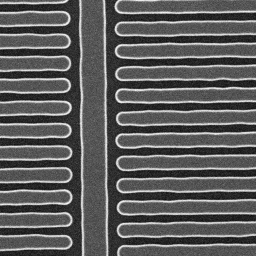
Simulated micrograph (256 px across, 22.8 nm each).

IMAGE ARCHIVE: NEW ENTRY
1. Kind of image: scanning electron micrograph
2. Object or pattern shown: groups of lines, slits or small figures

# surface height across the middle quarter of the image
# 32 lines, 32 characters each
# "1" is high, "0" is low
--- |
10001111110000000000000000000000
00001111110001111111111111111111
00001111110001111111111111111111
00001111110001111111111111111111
10001111110000000000000000000000
10001111110000000000000000000000
10001111110000111000111111111111
00000111110001111111111111111111
00000111110001111111111111111111
00000111110000111111111111111100
11001111110000000000000000000000
11001111110000000000000000000000
10001111110000111111111111111111
00001111110001111111111111111111
00001111110001111111111111111111
10001111110000000000000000000000
11001111110000000000000000000000
10001111110000000000000001110000
00001111110001111111111111111111
00000111110001111111111111111111
00000111110000111111011111111111
11000111110000000000000000000000
11000111110000000000000000000000
10000111110000111111111111111111
00000111110001111111111111111111
00000111110001111111111111111111
10000111110000000000000000000000
11000111110000000000000000000000
11000111110000000000000000000001
00000111110001111111111111111111
00000111110001111111111111111111
00000111111000111111111111111111